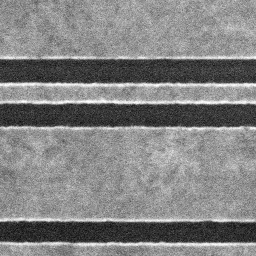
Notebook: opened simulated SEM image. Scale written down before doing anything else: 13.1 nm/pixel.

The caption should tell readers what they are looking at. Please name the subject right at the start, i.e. lines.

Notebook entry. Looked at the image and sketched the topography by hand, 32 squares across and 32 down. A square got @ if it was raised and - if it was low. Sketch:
@@@@@@@@@@@@@@@@@@@@@@@@@@@@@@@@
@@@@@@@@@@@@@@@@@@@@@@@@@@@@@@@@
@@@@@@@@@@@@@@@@@@@@@@@@@@@@@@@@
@@@@@@@@@@@@@@@@@@@@@@@@@@@@@@@@
@@@@@@@@@@@@@@@@@@@@@@@@@@@@@@@@
@@@@@@@@@@@@@@@@@@@@@@@@@@@@@@@@
@@@@@@@@@@@@@@@@@@@@@@@@@@@@@@@@
--------------------------------
--------------------------------
--------------------------------
@@@@@@@@--@---@@-@@-@@@---------
@@@@@@@@@@@@@@@@@@@@@@@@@@@@@@@@
@@@@@@@@@@@@@@@@@@@@@@@@@@@@@@@@
--------------------------------
--------------------------------
--------------------------------
@@@@@@@@@@@@@@@@@@@@@@@@@@@@@@@@
@@@@@@@@@@@@@@@@@@@@@@@@@@@@@@@@
@@@@@@@@@@@@@@@@@@@@@@@@@@@@@@@@
@@@@@@@@@@@@@@@@@@@@@@@@@@@@@@@@
@@@@@@@@@@@@@@@@@@@@@@@@@@@@@@@@
@@@@@@@@@@@@@@@@@@@@@@@@@@@@@@@@
@@@@@@@@@@@@@@@@@@@@@@@@@@@@@@@@
@@@@@@@@@@@@@@@@@@@@@@@@@@@@@@@@
@@@@@@@@@@@@@@@@@@@@@@@@@@@@@@@@
@@@@@@@@@@@@@@@@@@@@@@@@@@@@@@@@
@@@@@@@@@@@@@@@@@@@@@@@@@@@@@@@@
@@@@@@@@@@@@@@@@@@@@@@@@@@@@@@@@
--------------------------------
--------------------------------
@@@@@@@@@@@@@@@@@@@@@@@@@@@@@@@@
@@@@@@@@@@@@@@@@@@@@@@@@@@@@@@@@